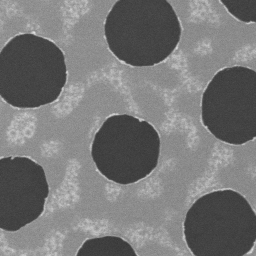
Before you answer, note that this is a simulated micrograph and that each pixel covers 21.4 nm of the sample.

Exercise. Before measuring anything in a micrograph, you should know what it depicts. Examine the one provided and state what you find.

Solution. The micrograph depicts holes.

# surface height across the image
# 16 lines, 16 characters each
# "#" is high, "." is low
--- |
#######....###..
#######....#####
#..####....#####
....###...######
....##########..
....#########...
#..##########...
#######..####...
######....###...
######....######
...###....######
...#############
...#########...#
..##########....
############....
#####...####....